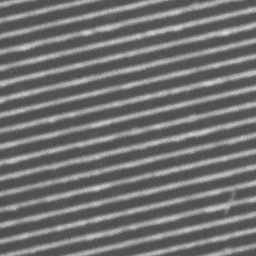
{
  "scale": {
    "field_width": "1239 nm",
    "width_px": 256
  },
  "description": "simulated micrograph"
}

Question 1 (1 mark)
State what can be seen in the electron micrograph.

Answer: parallel lines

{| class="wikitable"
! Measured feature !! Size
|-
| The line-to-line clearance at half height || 54.3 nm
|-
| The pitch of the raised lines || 0.0744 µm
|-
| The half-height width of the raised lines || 18.3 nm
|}